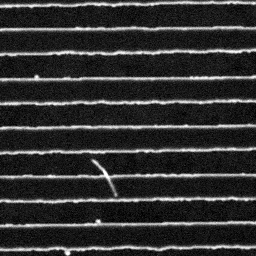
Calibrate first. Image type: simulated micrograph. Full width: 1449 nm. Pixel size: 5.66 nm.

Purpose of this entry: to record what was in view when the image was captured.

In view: lines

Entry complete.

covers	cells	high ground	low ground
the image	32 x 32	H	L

HHHHHHHHHHHHHHHHHHHHLLLLLLLLLLLH
LLLLLLLLLLLLLLLLLLLLLLLLLLLLLLLL
LLLLLLLLLLLLLLLLLLLLLLLLLLLLLLLL
LLLLLLLLLHHHHLHHHHHHHHHHHHHHHHHH
HHHHHHHHHHHHHHHHHHHHHHHHHHHHHHHH
HHHHHHHHHHHHHHHHHHHHHHHHHHHHHHHH
HHHHHHHHHHHHHHHHHHHHHHLHHHLLHHLL
LLLLLLLLLLLLLLLLLLLLLLLLLLLLLLLL
LLLLLLLLLLLLLLLLLLLLLLLLLLLLLLLL
LLLLLLLLLLLLLLLLLLLLLLLLLLLLLLLL
HHHHHHHHHHHHHHHHHHHHHHHHHHHHHHHH
HHHHHHHHHHHHHHHHHHHHHHHHHHHHHHHH
HHHHHHHHHHHHHHHHHHHHHHHHHHHHHHHH
LLLLLLLLLLLLLLLLLLLLLLLLLLLLLLLL
LLLLLLLLLLLLLLLLLLLLLLLLLLLLLLLL
LLLLLLLLLLLLLLLLLLLLLLLLLLLLLLLL
HHHHHHHHHHHHHHHHHHHHHHHHHHHHHHHH
HHHHHHHHHHHHHHHHHHHHHHHHHHHHHHHH
HHHHHHHHHHHHHHHHHHHHHHHHHHHHHHHH
LLLLLLLLLLLLLLLLLLLLLLLLLLLLLLLL
LLLLLLLLLLLLLLLLLLLLLLLLLLLLLLLL
LLLLLLLLLLLLLLLLLLLLLLLLLLLLLLLL
HHHHHHHHHHHHHHHHHHHHHHHHHHHHHHHH
HHHHHHHHHHHHHHHHHHHHHHHHHHHHHHHH
HHHHHHHHHHHHHHHHHHHHHHHHHHHHHHHH
LLLLLLLLLLLLLLLLLLLLLLLLLLLLLLLL
LLLLLLLLLLLLLLLLLLLLLLLLLLLLLLLL
LLLLLLLLLLLLLLLLLLLLLLLLLLLLLLLL
HHHHHHHHHHHHHHHHHHHHHHHHHHHHHHHH
HHHHHHHHHHHHHHHHHHHHHHHHHHHHHHHH
HHHHHHHHHHHHHHHHHHHHHHHHHHHHHHHH
LLLLLLLLHLLLLLLLLLLLLLLLLLLLLLLL